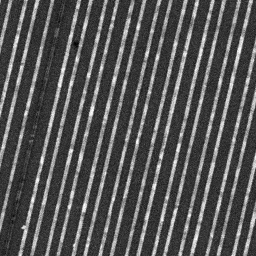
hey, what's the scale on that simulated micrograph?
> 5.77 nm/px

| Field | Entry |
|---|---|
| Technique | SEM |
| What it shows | parallel lines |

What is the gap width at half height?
52.7 nanometres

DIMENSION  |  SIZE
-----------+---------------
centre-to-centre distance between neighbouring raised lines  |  74.9 nanometres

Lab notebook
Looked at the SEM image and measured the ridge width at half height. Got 16.2 nm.